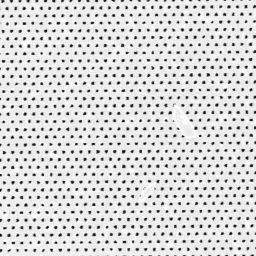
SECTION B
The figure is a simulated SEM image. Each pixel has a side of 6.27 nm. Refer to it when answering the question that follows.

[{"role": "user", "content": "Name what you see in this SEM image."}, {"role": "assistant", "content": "a regular array of holes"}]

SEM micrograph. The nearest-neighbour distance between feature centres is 0.0512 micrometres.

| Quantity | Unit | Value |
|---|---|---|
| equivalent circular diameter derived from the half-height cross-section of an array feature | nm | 21.2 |